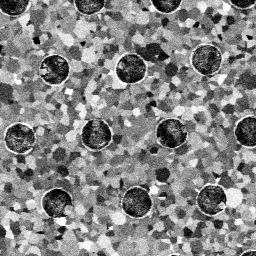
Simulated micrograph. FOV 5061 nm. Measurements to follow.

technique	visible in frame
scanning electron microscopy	a regular array of holes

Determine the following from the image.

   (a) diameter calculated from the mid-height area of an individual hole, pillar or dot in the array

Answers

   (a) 606 nm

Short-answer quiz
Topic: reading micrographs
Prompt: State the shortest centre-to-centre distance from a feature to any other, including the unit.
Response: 1490 nm